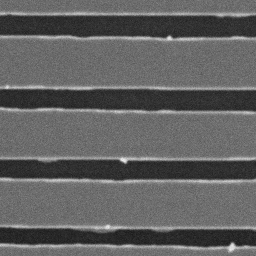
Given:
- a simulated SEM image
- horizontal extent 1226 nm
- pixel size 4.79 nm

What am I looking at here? lines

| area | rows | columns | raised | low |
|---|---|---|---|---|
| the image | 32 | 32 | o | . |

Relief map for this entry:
oooooooooooooooooooooooooooooooo
oooooooooooooooooooooooooooooooo
................................
................................
................................
oooooooooooooooooooooooooooooooo
oooooooooooooooooooooooooooooooo
oooooooooooooooooooooooooooooooo
oooooooooooooooooooooooooooooooo
oooooooooooooooooooooooooooooooo
oooooooooooooooooooooooooooooooo
................................
................................
o...............................
oooooooooooooooooooooooooooooooo
oooooooooooooooooooooooooooooooo
oooooooooooooooooooooooooooooooo
oooooooooooooooooooooooooooooooo
oooooooooooooooooooooooooooooooo
oooooooooooooooooooooooooooooooo
................................
................................
oooooooooooo...................o
oooooooooooooooooooooooooooooooo
oooooooooooooooooooooooooooooooo
oooooooooooooooooooooooooooooooo
oooooooooooooooooooooooooooooooo
oooooooooooooooooooooooooooooooo
...........ooooooooooooooooooooo
................................
................................
oooooooooooooooooooooooooooooooo